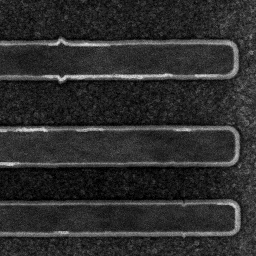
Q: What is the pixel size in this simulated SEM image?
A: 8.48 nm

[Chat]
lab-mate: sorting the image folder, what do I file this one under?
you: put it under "one or a few lines or trenches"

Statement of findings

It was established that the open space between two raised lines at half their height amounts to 391 nm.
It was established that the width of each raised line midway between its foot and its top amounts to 302 nanometers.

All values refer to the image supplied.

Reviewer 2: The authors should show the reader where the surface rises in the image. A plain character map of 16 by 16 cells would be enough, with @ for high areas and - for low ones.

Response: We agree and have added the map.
----------------
----------------
----------------
@@@@@@@@@@@@@@@-
@@@@@@@@@@@@@@@-
----------------
----------------
----------------
@@@@@@@@@@@@@@@-
@@@@@@@@@@@@@@@-
----------------
----------------
----------------
@@@@@@@@@@@@@@@-
@@@@@@@@@@@@@@--
----------------